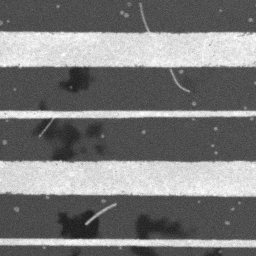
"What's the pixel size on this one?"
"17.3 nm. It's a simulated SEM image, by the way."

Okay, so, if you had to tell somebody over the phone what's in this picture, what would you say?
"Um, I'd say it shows lines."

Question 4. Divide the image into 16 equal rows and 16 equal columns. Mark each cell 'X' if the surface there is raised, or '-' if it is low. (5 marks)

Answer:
----------------
----------------
XXXXXXXXXXXXXXXX
XXXXXXXXXXXXXXXX
----------------
----------------
----------------
----------------
----------------
----------------
XXXXXXXXXXXXXXXX
XXXXXXXXXXXXXXXX
----------------
----------------
----------------
----------------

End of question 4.